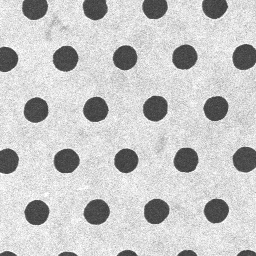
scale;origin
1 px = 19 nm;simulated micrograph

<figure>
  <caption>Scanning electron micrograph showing a regular array of holes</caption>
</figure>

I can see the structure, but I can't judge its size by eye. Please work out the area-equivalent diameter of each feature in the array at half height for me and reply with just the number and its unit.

476 nm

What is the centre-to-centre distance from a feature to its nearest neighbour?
1120 nm